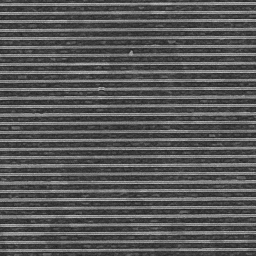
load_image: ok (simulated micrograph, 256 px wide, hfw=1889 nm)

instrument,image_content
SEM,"parallel lines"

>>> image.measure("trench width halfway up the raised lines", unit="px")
6.25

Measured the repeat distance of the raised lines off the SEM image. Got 8.48 px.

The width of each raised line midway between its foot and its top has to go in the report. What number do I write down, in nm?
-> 18.4